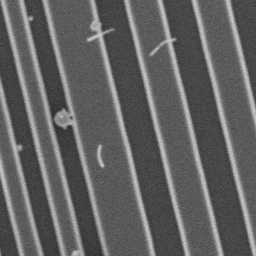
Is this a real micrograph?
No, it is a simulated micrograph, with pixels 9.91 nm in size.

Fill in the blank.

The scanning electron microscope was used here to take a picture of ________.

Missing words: groups of lines, slits or small figures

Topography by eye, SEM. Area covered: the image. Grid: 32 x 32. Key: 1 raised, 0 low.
11100011111100001111000011111000
01100011111100001111000001111000
01100011111100001111100001111000
01110011111100000111100001111000
01110001111110000111100001111100
00110001111110000111100001111100
00110001111110000111110000111100
00111001111110000011110000111100
00111000111111000011110000111110
00111000111111000011110000011110
00011000111111000011111000011110
00011000111111000011111000011110
10011100111111100001111000011110
10011100011111100001111000011111
10001101111111100001111100001111
10001101111111100001111100001111
10001110011111100000111100001111
11001110001111110000111100001111
11000110001111110000111100000111
11000110001111110000111110000111
11000111001111111000011110000111
11100111000111111000011110000111
11100011000111111000011110000011
01100011000111111000011111000011
01100011100111111000001111000011
01110011100011111100001111000011
01110001100011111100001111000001
00110001100011111100001111100001
00110001110011111100000111100001
00111001110001111110000111100001
00111000110001111110000111100001
00111000110001111110000111110000